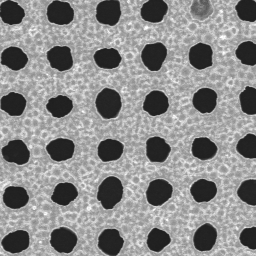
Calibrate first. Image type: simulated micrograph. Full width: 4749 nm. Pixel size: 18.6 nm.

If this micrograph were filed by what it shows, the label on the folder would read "a regular array of holes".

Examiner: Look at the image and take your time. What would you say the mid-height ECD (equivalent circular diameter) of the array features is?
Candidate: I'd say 471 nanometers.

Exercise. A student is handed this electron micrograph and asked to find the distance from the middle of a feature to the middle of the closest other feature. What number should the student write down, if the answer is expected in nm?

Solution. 827